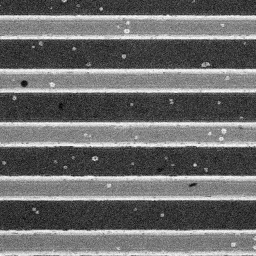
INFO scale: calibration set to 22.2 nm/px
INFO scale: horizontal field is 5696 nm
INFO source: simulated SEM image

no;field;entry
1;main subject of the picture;lines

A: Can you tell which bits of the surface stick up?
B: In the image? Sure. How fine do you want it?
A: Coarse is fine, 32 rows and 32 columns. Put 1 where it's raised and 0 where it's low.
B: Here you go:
00000000000000000000000000000000
00000000000000000000000000000000
11111111111111111111111111111111
11111111111111111111111111111111
11111111111111111111111111111111
00000000000000000000000000000000
00000000000000000000000000000000
00000000000000000000000000000000
00000000000000000000000000000000
11111111111111111111111111111111
11111111111111111111111111111111
00000000000000000000000000000000
00000000000000000000000000000000
00000000000000000000000000000000
00000000000000000000000000000000
11111111111111111111111111111111
11111111111111111111111111111111
11111111111111111111111111111111
00000000000000000000000000000000
00000000000000000000000000000000
00000000000000000000000000000000
00000000000000000000000000000000
11111111111111111111111111111111
11111111111111111111111111111111
11111111111111111111111111111111
00000000000000000000000000000000
00000000000000000000000000000000
00000000000000000000000000000000
00000000000000000000000000000000
11111111111111111111111111111111
11111111111111111111111111111111
11111111111111111111111111111111